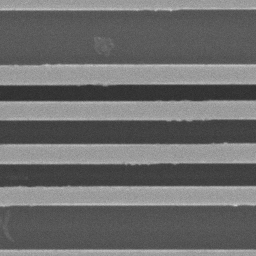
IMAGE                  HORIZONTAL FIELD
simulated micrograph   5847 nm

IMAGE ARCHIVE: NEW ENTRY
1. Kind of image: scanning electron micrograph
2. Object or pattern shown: lines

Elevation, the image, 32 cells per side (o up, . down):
oooooooooooooooooooooooooooooooo
................................
................................
................................
................................
................................
................................
................................
oooooooooooooooooooooooooooooooo
oooooooooooooooooooooooooooooooo
ooooooooooo...o.................
................................
................................
oooooooooooooooooooooooooooooooo
oooooooooooooooooooooooooooooooo
................................
................................
................................
oooooooooooooooooooooooooooooooo
oooooooooooooooooooooooooooooooo
................................
................................
................................
oooooooooooooooooooooooooooooooo
oooooooooooooooooooooooooooooooo
oooooooooooooooooooooooooooooo.o
................................
................................
................................
................................
................................
oooooooooooooooooooooooooooooooo